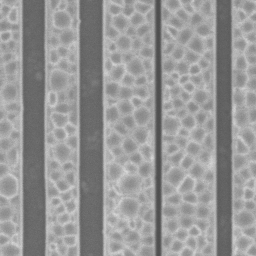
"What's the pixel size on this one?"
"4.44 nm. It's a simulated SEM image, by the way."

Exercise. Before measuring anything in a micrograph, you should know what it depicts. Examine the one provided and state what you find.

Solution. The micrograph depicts one or a few lines or trenches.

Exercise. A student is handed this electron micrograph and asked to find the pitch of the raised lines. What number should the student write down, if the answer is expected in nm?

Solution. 280